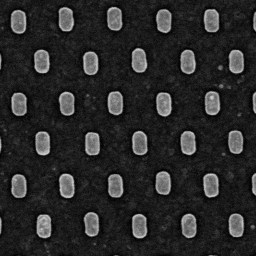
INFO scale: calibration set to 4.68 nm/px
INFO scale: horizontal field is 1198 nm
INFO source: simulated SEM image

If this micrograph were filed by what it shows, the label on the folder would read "a regular array of raised bodies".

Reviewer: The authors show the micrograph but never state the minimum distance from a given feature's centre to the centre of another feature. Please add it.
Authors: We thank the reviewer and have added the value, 217 nm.